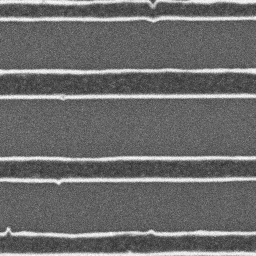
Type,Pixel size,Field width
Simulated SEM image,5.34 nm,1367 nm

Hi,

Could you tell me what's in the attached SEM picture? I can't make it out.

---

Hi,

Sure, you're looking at one or a few lines or trenches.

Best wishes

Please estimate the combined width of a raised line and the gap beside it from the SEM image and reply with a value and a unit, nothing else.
427 nanometers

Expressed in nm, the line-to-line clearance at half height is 283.